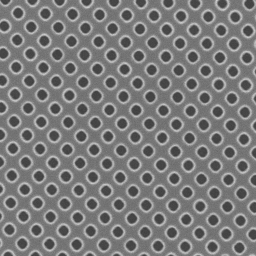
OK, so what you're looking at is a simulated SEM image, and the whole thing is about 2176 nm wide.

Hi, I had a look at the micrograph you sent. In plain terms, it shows a regular array of holes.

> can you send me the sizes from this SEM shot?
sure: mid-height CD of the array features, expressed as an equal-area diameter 92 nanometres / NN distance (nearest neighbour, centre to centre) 160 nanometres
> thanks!